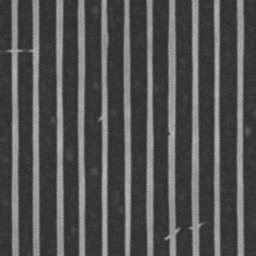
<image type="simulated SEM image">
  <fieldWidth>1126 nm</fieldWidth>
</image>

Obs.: parallel lines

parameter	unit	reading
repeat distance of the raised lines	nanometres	99.2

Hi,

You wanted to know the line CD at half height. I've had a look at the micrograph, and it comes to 25.9 nm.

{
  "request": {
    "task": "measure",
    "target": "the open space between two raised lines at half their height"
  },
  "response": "74.3 nanometres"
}